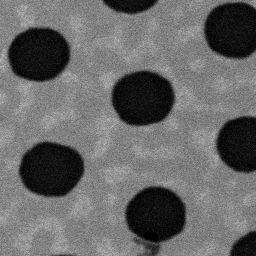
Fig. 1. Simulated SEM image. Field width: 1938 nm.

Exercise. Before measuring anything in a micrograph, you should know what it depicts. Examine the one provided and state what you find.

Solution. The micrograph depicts holes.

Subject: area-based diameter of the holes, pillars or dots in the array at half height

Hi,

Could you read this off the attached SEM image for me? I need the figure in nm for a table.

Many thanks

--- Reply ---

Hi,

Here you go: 443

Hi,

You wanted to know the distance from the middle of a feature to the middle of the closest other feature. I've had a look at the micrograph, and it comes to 113 pixels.